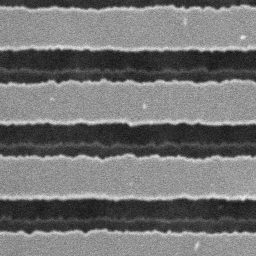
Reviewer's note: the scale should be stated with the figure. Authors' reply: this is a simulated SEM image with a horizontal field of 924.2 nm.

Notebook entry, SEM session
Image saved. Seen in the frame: lines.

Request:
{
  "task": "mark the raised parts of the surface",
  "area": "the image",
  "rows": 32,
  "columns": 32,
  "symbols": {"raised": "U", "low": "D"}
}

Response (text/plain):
DDDDDDDDDDDDDDDDDDDDDDDDDDDDDDDD
UUUUUUUUUUUUUUUUUUUUUUUUUUUUUUUU
UUUUUUUUUUUUUUUUUUUUUUUUUUUUUUUU
UUUUUUUUUUUUUUUUUUUUUUUUUUUUUUUU
UUUUUUUUUUUUUUUUUUUUUUUUUUUUUUUU
UUUUUUUUUUUUUUUUUUUUUUUUUUUUUUUU
DDDDDDDDDDDDDDDDDDDDDDDDDDDDDDDD
DDDDDDDDDDDDDDDDDDDDDDDDDDDDDDDD
DDDDDDDDDDDDDDDDDDDDDDDDDDDDDDDD
DDDDDDDDDDDDDDDDDDDDDDDDDDDDDDDD
UUUUUUUUUUUUUUUUUUUUUUUUUUUUUUUU
UUUUUUUUUUUUUUUUUUUUUUUUUUUUUUUU
UUUUUUUUUUUUUUUUUUUUUUUUUUUUUUUU
UUUUUUUUUUUUUUUUUUUUUUUUUUUUUUUU
UUUUUUUUUUUUUUUUUUUUUUUUUUUUUUUU
UUUUDDUUUDDUDDDDUUUDDDDDDUUUUUUD
DDDDDDDDDDDDDDDDDDDDDDDDDDDDDDDD
DDDDDDDDDDDDDDDDDDDDDDDDDDDDDDDD
DDDDDDDDDDDDDDDDDDDDDDDDDDDDDDDD
DDDDDDDUDDUDDDDUUDDUDDDDDDDDDDUD
UUUUUUUUUUUUUUUUUUUUUUUUUUUUUUUU
UUUUUUUUUUUUUUUUUUUUUUUUUUUUUUUU
UUUUUUUUUUUUUUUUUUUUUUUUUUUUUUUU
UUUUUUUUUUUUUUUUUUUUUUUUUUUUUUUU
UUUUUUUUUUUUUUUUUUUUUUUUUUUUUUUU
DDDDDDDDDDDDDDDDDDDDDDDDDDDDDDDD
DDDDDDDDDDDDDDDDDDDDDDDDDDDDDDDD
DDDDDDDDDDDDDDDDDDDDDDDDDDDDDDDD
DDDDDDDDDDDDDDDDDDDDDDDDDDDDDDDD
UUUUUUUUUUUUUUUUUUUUUUUUUUUUUUUU
UUUUUUUUUUUUUUUUUUUUUUUUUUUUUUUU
UUUUUUUUUUUUUUUUUUUUUUUUUUUUUUUU